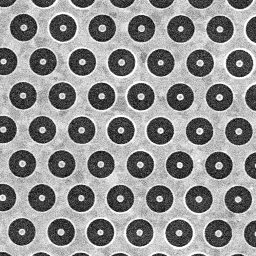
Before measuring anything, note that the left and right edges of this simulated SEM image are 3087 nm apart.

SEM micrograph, an array of small figures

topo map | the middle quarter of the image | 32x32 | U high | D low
UDDDDDDDUUUDDDDDDDUUUDDDDDDDUUUD
UUDDDDDDUUUDDDDDDDUUUDDDDDDUUUUD
UUDDDDDUUUUUDDDDDUUUUUDDDDUUUUUU
UUUUUUUUUUUUUUUUUUUUUUUUUUUUUUUU
UUUUUUUUUDUUUUUUUUUDUUUUUUUUUUUU
DDUUUUUDDDDDUUUUUDDDDDUUUUUDDDDU
DDDUUUDDDDDDDUUUDDDDDDUUUUDDDDDD
DDDUUUDDDDDDDUUUDDDDDDDUUUDDDDDD
DDDUUUDDDDDDDUUDDDDDDDDUUDDDDDDD
DDDUUUDDDDDDDUUUDDDDDDDUUUDDDDDD
DDUUUUUDDDDDUUUUDDDDDDUUUUDDDDDD
UUUUUUUUDDUUUUUUUUDDDUUUUUUUDDUU
UUUUUUUUUUUUUUUUUUUUUUUUUUUUUUUU
UUUDDDUUUUUUDDDDUUUUUUUDDUUUUUUU
UDDDDDDUUUUDDDDDDUUUUDDDDDDUUUUD
UDDDDDDDUUUDDDDDDDUUUDDDDDDUUUUD
UDDDDDDDUUUDDDDDDDUUDDDDDDDDUUDD
UDDDDDDDUUUDDDDDDDUUUDDDDDDDUUDD
UDDDDDDUUUUDDDDDDUUUUDDDDDDUUUUD
UUDDDDUUUUUUDDDDUUUUUUDDDDUUUUUU
UUUUUUUUUUUUUUUUUUUUUUUUUUUUUUUU
UUUUUUUUUUUUUUUUUUUDUUUUUUUUUUUU
DDUUUUUDDDDDUUUUUDDDDUUUUUUDDDDU
DDDUUUDDDDDDUUUUDDDDDDUUUUDDDDDD
DDDUUUDDDDDDDUUUDDDDDDDUUDDDDDDD
DDDUUUDDDDDDDUUUDDDDDDDUUDDDDDDD
DDDUUUDDDDDDUUUUDDDDDDUUUUDDDDDD
DDUUUUUDDDDDUUUUDDDDDDUUUUDDDDDD
UUUUUUUUDDUUUUUUUUDDUUUUUUUUDDUU
UUUUUUUUUUUUUUUUUUUUUUUUUUUUUUUU
UUDDDDUUUUUUUDDDUUUUUUUDDUUUUUUU
UDDDDDDUUUUDDDDDDUUUUDDDDDDUUUUD